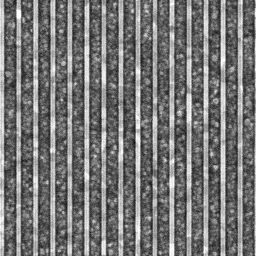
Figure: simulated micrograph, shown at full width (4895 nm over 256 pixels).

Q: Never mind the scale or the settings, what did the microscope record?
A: parallel lines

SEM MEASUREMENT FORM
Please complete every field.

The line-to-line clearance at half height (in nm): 265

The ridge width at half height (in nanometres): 64.5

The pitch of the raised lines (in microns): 0.326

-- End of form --